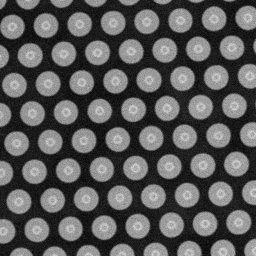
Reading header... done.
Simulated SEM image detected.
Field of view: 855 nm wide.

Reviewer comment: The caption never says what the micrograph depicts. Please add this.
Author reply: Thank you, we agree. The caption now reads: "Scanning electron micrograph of an array of small figures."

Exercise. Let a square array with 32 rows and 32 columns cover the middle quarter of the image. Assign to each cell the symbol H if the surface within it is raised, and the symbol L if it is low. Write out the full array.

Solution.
HLLLLLLLLLLLLLLLLLLLLLLLLLLLLLLL
LLLLLLLLLLLLHHLLLLLLHHHLLLLLHHHH
LLHHHHHLLLHHHHHLLLLHHHHHLLLHHHHH
LLHHHHHLLLHHHHHHLLHHHHHHLLLHHHHH
LHHHHHHLLLHHHHHHLLHHHHHHLLLHHHHH
LHHHHHHLLLHHHHHHLLLHHHHHLLLHHHHH
LLHHHHHLLLLHHHHLLLLLHHHLLLLLLHHL
LLLLHHLLLLLLLLLLLLLLLLLLLLLLLLLL
LLLLLLLLLLLLLLLLLLLLLLLLHHHLLLLL
HHLLLLLHHHHLLLLHHHHHLLLHHHHHLLLH
HHHLLLHHHHHHLLLHHHHHLLLHHHHHHLLH
HHHLLLHHHHHHLLHHHHHHLLLHHHHHHLLH
HHHLLLHHHHHHLLHHHHHHLLLHHHHHLLLL
HHHLLLLHHHHLLLLHHHHLLLLLHHHHLLLL
HHLLLLLLHHLLLLLLLLLLLLLLLLLLLLLL
LLLLLLLLLLLLLLLLLLLLLLLLLLLLLHHL
LLLLHHLLLLLLHHHLLLLLHHHHLLLLHHHH
LLLHHHHHLLLHHHHHLLLHHHHHHLLHHHHH
LLHHHHHHLLLHHHHHLLLHHHHHHLLHHHHH
LLHHHHHHLLLHHHHHLLLHHHHHHLLHHHHH
LLHHHHHHLLLHHHHHLLLLHHHHLLLLHHHH
LLLHHHHLLLLLHHHLLLLLLHHLLLLLLLLL
LLLLLLLLLLLLLLLLLLLLLLLLLLLLLLLL
LLLLLLLLHHLLLLLLHHHHLLLLHHHHLLLL
HHHLLLLHHHHHLLLHHHHHHLLLHHHHHLLL
HHHHLLLHHHHHLLLHHHHHHLLHHHHHHLLL
HHHHLLLHHHHHLLLHHHHHHLLHHHHHHLLL
HHHHLLLHHHHHLLLHHHHHHLLLHHHHHLLL
HHHLLLLHHHHHLLLLHHHLLLLLLHHLLLLL
HHLLLLLLLLLLLLLLLLLLLLLLLLLLLLLL
LLLLLLLLLLLLLLLLLLLLLHHHLLLLLHHH
LLLLHHHHLLLLHHHHLLLLHHHHHLLLHHHH